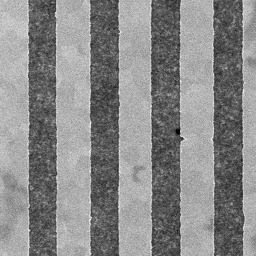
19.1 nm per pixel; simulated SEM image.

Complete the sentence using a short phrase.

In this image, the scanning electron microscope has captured one or a few lines or trenches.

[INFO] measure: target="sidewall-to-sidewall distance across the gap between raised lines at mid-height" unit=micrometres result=0.546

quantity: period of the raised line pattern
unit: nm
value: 1180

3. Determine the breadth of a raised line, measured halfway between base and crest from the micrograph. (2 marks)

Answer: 634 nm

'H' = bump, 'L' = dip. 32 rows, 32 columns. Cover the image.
HHHHLLLHHHHLLLLHHHHLLLLHHHHLLLHH
HHHLLLLHHHHLLLLHHHHLLLLHHHHLLLHH
HHHHLLLHHHHLLLLHHHHLLLLHHHHLLLHH
HHHHLLLHHHHLLLLHHHHLLLLHHHHLLLHH
HHHHLLLHHHHLLLLHHHHLLLLHHHHLLLHH
HHHHLLLHHHHLLLLHHHHLLLLHHHHLLLHH
HHHHLLLHHHHLLLLHHHHLLLLHHHHLLLHH
HHHHLLLHHHHLLLLHHHHLLLLHHHHLLLHH
HHHLLLLHHHHLLLLHHHHLLLLHHHHLLLHH
HHHLLLLHHHHLLLLHHHHLLLHHHHHLLLHH
HHHLLLLHHHHLLLLHHHHLLLLHHHHLLLHH
HHHLLLLHHHHLLLLHHHHLLLLHHHHLLLHH
HHHHLLLHHHHLLLLHHHHLLLLHHHHLLLHH
HHHLLLLHHHHLLLLHHHHLLLLHHHHLLLHH
HHHHLLLHHHHLLLLHHHHLLLLHHHHLLLHH
HHHHLLLHHHHLLLLHHHHLLLLHHHHLLLHH
HHHHLLLHHHHLLLLHHHHLLLLHHHHLLLHH
HHHHLLLHHHHLLLLHHHHLLLLHHHHLLLHH
HHHHLLLHHHHLLLLHHHHLLLLHHHHLLLHH
HHHHLLLHHHHLLLLHHHHLLLLHHHHLLLHH
HHHHLLLHHHHLLLLHHHHLLLLHHHHLLLHH
HHHHLLLHHHHLLLLHHHHLLLLHHHHLLLHH
HHHHLLLHHHHLLLLHHHHLLLLHHHHLLLHH
HHHHLLLHHHHLLLLHHHHLLLLHHHHLLLHH
HHHHLLLHHHHLLLLHHHHLLLLHHHHLLLHH
HHHHLLLHHHHLLLLHHHHLLLLHHHHLLLHH
HHHHLLLHHHHLLLLHHHHLLLLHHHHLLLHH
HHHHLLLHHHHLLLLHHHHLLLHHHHHLLLLH
HHHHLLLHHHHLLLLHHHHLLLLHHHHLLLHH
HHHHLLLHHHHLLLLHHHHLLLLHHHHLLLHH
HHHHLLLHHHHLLLLHHHHLLLLHHHHLLLHH
HHHHLLLHHHHLLLLHHHHLLLLHHHHLLLHH